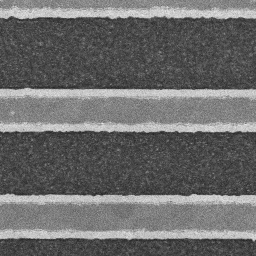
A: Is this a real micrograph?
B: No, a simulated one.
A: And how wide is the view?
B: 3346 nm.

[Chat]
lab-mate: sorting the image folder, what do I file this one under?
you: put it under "one or a few lines or trenches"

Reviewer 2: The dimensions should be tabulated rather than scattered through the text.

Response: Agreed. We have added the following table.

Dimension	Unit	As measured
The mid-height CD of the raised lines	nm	469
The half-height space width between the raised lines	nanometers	976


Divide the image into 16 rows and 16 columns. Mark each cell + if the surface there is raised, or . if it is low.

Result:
++++++++++++++++
................
................
................
................
................
++++++++++++++++
++++++++++++++++
................
................
................
................
++++++++++++++++
++++++++++++++++
++++++++++++++++
................